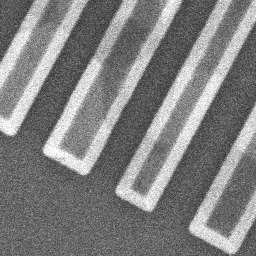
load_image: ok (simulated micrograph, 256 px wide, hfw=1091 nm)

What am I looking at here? one or a few lines or trenches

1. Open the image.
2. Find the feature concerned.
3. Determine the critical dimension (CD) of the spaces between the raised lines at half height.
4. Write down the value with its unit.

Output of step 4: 187 nm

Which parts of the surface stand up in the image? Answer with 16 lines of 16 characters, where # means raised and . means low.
..###...###...##
..##...###...##.
.###...###...##.
.##...###...##..
###...###...##..
##...###...##...
##...##....##...
#...###...##....
....##...###...#
....##...##....#
........###...##
........##....##
.............###
.............###
.............##.
................